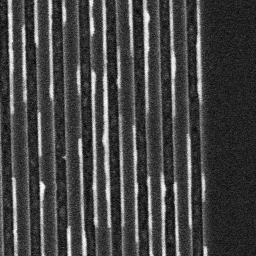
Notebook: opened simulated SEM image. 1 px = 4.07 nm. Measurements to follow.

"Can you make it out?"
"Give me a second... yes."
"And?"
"parallel lines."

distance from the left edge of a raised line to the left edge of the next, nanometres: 110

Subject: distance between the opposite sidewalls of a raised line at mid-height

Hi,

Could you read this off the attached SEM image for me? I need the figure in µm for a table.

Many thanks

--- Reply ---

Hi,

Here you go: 0.0666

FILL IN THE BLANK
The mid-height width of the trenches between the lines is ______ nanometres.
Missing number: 44.2